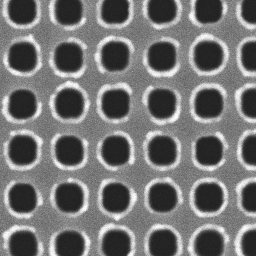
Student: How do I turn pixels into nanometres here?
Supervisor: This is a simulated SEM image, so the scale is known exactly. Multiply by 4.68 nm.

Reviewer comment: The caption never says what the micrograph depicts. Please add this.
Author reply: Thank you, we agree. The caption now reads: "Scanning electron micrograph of a regular array of holes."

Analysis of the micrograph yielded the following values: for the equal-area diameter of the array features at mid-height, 0.133 um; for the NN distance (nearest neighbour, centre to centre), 216 nm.